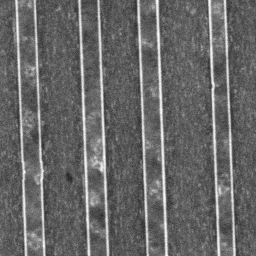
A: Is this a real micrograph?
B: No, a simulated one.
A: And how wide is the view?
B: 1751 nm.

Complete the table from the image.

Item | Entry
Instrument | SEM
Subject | one or a few lines or trenches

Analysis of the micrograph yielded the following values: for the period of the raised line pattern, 436 nm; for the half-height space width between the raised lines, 302 nm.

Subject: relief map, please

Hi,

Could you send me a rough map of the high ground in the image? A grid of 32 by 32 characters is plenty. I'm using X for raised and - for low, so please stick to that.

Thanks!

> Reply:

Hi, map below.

--XX------XX-----XXX------XX----
--XX------XX-----XXX------XX----
--XX------XX-----XXX------XX----
--XX------XX-----XXX------XX----
--XXX-----XXX----XXX------XX----
--XXX-----XXX----XXX------XX----
--XXX-----XXX----XXX------XX----
--XXX-----XXX-----XX------XX----
--XXX-----XXX-----XX------XX----
--XXX-----XXX-----XX-------X----
--XXX-----XXX-----XX-------X----
---XX-----XXX-----XX-------X----
---XX-----XXX-----XX-------XX---
---XX-----XXX-----XX-------XX---
---XX------XX-----XX-------XX---
---XX------XX-----XX-------XX---
---XX------XX-----XX-------XX---
---XX------XX-----XX-------XX---
---XX------XX-----XX-------XX---
---XX------XX-----XX-------XX---
---XX------XX-----XX-------XX---
---XX------XX-----XX-------XX---
---XX------XX-----XX-------XX---
---XX------XX-----XX-------XX---
---XX------XX-----XXX------XX---
---XX------XX-----XXX------XX---
---XX------XX-----XXX------XX---
---XX------XX-----XXX------XX---
---XX------XX-----XXX------XX---
---XX------XX-----XXX------XX---
---XX------XX-----XXX------XX---
---XXX-----XXX----XXX------XX---